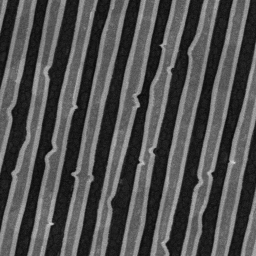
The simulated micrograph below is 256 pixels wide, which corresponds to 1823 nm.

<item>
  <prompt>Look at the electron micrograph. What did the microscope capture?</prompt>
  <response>parallel lines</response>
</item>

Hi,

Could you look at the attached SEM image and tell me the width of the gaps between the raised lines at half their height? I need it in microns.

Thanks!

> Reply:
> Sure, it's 0.119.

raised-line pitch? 29.7 px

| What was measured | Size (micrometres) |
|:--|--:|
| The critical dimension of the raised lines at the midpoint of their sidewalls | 0.0915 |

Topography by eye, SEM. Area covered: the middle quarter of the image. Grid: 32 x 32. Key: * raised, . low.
.***....****....****....***....*
.***....****....****....**.....*
.***....***.....****...****....*
.***....***....*****...***.....*
****....***....****...****.....*
****...****....****...****....**
***....****....****...****....**
***....***.....***....****....**
***....***.....***....***.....**
***....***....****....***.....**
***...****....*****...***....***
**....***.....****...****....***
**....***.....***....****....***
**....***.....***....***.....***
*.....***.....***....***.....***
*....****....****....***....****
*....****....***.....***....****
*....***.....***....***.....***.
.....***.....***....***.....***.
.....***....****....***....****.
.....**.....***.....***....****.
....***.....***.....**.....****.
....***.....***.....**.....***..
....***.....***....***.....***..
....***.....**.....***....****..
....***....***.....***....****..
...****....***....****....***...
..*****....***....***.....****..
...****....**.....***.....***...
...***.....**.....***.....***...
...***....***.....***....****...
...***....***.....***....****...